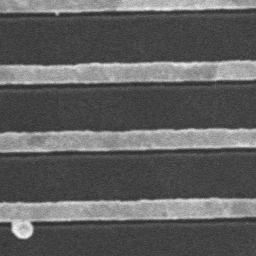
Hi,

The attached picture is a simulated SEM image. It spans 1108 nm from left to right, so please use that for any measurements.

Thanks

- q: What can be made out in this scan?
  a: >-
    lines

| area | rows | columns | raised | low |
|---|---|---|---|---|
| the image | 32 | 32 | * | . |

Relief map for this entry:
********************************
................................
................................
................................
................................
................................
................................
................................
********************************
********************************
................................
................................
................................
................................
................................
................................
.......*****.*.*****************
********************************
**********************..........
................................
................................
................................
................................
................................
................................
********************************
********************************
********........................
..**............................
..**............................
................................
................................